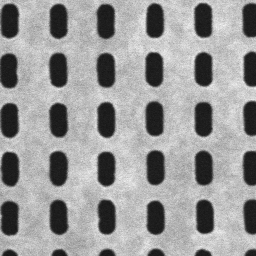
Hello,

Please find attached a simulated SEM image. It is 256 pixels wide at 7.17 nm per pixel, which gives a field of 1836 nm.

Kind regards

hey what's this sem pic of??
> a regular array of holes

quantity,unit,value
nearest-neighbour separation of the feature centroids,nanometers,344